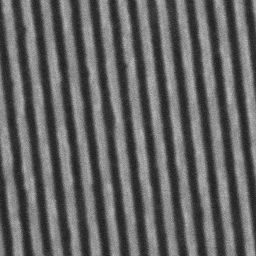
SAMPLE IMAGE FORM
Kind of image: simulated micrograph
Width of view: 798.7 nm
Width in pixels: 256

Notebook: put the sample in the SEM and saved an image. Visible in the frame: parallel lines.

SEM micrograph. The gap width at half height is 33.7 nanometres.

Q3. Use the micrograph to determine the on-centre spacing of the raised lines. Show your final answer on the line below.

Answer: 59.8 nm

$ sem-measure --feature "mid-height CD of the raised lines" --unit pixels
8.81